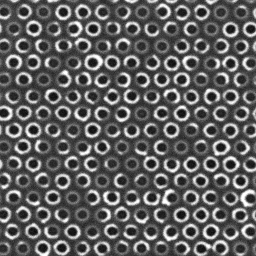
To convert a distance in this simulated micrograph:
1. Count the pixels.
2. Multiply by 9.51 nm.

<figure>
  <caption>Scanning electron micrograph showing a regular array of holes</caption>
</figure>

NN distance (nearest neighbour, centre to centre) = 19.1 pixels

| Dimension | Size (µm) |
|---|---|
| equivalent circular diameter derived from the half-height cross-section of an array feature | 0.0969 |